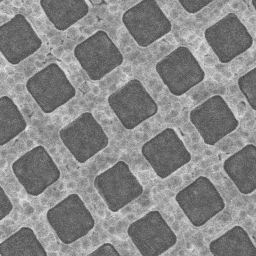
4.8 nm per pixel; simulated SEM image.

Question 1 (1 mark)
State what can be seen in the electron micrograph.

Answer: a regular array of holes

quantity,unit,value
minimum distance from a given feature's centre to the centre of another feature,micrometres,0.279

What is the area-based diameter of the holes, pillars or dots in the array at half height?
214 nm